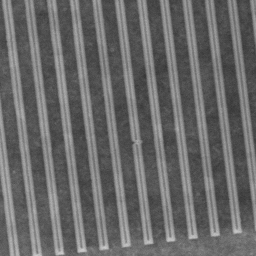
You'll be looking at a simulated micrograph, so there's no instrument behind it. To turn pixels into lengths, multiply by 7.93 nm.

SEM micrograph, parallel lines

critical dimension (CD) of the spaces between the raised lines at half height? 16.1 pixels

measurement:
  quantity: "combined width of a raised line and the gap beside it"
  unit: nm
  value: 177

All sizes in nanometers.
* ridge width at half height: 49.2